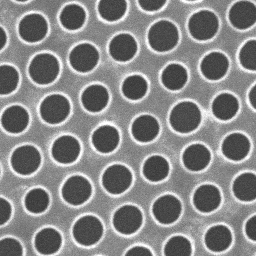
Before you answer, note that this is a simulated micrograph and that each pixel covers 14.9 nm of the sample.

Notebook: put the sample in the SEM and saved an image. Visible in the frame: a regular array of holes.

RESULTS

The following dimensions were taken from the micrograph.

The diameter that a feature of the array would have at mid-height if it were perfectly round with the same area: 437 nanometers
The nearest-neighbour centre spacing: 41.1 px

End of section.